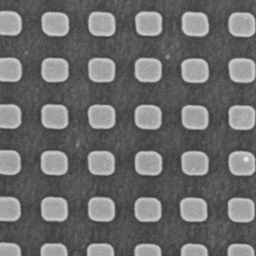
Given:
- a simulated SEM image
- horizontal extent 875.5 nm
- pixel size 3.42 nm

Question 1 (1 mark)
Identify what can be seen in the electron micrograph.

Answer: a regular array of raised bodies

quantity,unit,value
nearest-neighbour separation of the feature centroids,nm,158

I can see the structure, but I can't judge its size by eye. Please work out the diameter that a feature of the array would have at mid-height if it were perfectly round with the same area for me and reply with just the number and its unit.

92.4 nm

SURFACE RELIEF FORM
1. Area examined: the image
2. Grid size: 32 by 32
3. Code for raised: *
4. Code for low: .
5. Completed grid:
................................
**..............................
***..****..***...***...***...***
***..****..***...***...***...***
.............................**.
................................
................................
**....**...***...***...**....**.
***..***...***...***...***...***
***..***...***...***...***...***
................................
................................
................................
**...***...***...***...***...**.
***..***...***...***...***...***
**...***...***...***...***...***
................................
................................
................................
**...***...***...***...***...***
**...***...***...***...***...***
**...***...***...***...***...***
................................
................................
................................
**...***...***...***...***...***
**...***...***...***...***...***
**....**....**...***...**....**.
................................
................................
**....*......................*..
***..***...***...***...***..****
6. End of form